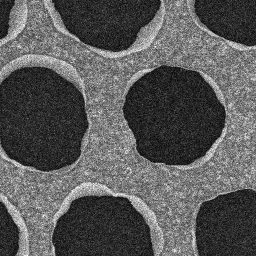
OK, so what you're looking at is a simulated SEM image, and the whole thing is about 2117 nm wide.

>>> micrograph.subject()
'holes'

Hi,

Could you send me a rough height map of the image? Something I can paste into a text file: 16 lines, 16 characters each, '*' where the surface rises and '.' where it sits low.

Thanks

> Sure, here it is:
.**.......**....
.***......**....
*****....*****..
****************
....*****...****
.....***.....***
.....***......**
......**......**
.....***......**
.....****....***
**..************
****************
*****...*****...
.***.....***....
.**.......**....
.**.......**....